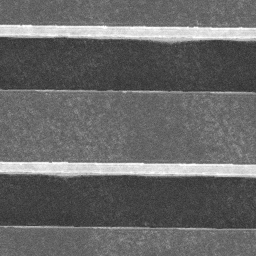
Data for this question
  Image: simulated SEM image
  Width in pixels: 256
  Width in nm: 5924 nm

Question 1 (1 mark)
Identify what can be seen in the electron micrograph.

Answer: lines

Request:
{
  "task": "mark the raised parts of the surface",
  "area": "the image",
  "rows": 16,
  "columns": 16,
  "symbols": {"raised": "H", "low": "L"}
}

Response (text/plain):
HHHHHHHHHHHHHHHH
HHHHHHHHHHHHHHHH
LLLLLLLLLLLLLLLL
LLLLLLLLLLLLLLLL
LLLLLLLLLLLLLLLL
LLLLLLLLLLLLLLLL
HHHHHHHHHHHHHHHH
HHHHHHHHHHHHHHHH
HHHHHHHHHHHHHHHH
HHHHHHHHHHHHHHHH
HHHHHHHHHHHHHHHH
LLLLLLLLLLLLLLLL
LLLLLLLLLLLLLLLL
LLLLLLLLLLLLLLLL
HHHHHHHHHHHHHHHH
HHHHHHHHHHHHHHHH